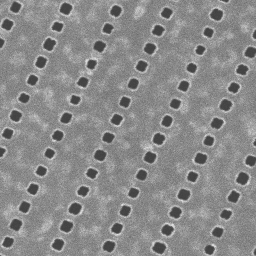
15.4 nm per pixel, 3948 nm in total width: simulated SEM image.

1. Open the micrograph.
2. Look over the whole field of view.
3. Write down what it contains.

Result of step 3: a regular array of holes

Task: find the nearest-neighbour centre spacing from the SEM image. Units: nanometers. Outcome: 301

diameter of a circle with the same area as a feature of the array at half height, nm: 173